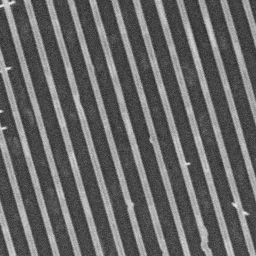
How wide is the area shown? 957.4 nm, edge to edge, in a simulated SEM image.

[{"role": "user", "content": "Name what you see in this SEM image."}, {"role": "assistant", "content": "parallel lines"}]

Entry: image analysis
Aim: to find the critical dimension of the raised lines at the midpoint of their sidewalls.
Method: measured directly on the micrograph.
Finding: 22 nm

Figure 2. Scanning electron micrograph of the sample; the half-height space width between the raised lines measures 0.0571 µm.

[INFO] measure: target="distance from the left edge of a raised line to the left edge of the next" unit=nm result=78.5